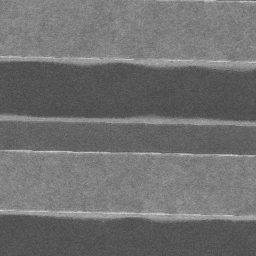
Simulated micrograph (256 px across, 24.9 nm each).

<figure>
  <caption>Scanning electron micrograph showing lines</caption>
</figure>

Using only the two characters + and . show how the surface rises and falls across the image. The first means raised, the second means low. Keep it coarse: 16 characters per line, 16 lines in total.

++++++++++++++++
++++++++++++++++
++++++++++++++++
++++++++++++++++
................
................
................
................
................
+++++...........
++++++++++++++++
++++++++++++++++
++++++++++++++++
................
................
................